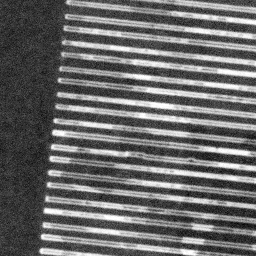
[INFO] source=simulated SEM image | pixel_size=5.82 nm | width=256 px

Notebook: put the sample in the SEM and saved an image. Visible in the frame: parallel lines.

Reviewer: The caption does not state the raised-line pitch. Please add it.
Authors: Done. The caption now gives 76.2 nanometres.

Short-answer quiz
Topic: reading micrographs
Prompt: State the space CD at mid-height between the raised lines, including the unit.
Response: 52.2 nm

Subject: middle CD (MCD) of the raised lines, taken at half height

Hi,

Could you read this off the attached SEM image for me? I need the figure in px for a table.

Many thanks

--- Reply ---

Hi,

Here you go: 3.47